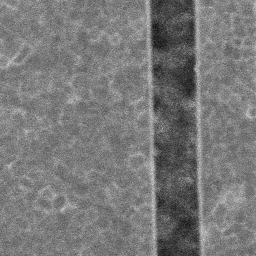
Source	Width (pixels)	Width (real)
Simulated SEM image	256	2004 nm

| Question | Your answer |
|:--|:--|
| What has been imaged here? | one or a few lines or trenches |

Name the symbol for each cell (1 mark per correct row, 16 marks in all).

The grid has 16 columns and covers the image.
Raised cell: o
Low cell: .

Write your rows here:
ooooooooo...oooo
ooooooooo...oooo
ooooooooo...oooo
ooooooooo...oooo
ooooooooo...oooo
ooooooooo...oooo
ooooooooo...oooo
ooooooooo...oooo
ooooooooo...oooo
ooooooooo....ooo
ooooooooo...oooo
oooooooooo...ooo
oooooooooo...ooo
oooooooooo...ooo
oooooooooo...ooo
oooooooooo...ooo